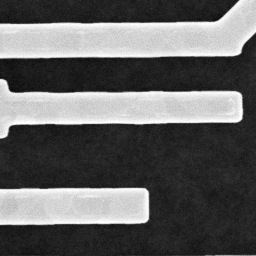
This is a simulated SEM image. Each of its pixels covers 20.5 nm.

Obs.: wiring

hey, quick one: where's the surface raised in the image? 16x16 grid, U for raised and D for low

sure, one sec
DDDDDDDDDDDDDDUU
DDDUUUUUUUUUUUUU
UUUUUUUUUUUUUUUU
UUUUUUUUUUDDDDDD
DDDDDDDDDDDDDDDD
UDDDDDDDDDDDDDDD
UUUUUUUUUUUUUUUD
UUUUUUUUUUUUUUUD
DDDDDDDDDDDDDDDD
DDDDDDDDDDDDDDDD
DDDDDDDDDDDDDDDD
DDDDDDDDDDDDDDDD
UUUUUUUUUDDDDDDD
UUUUUUUUUDDDDDDD
DDDDDDDDDDDDDDDD
DDDDDDDDDDDDDDDD